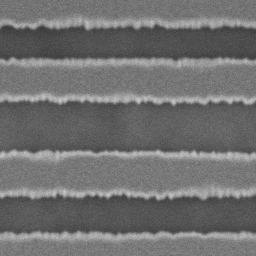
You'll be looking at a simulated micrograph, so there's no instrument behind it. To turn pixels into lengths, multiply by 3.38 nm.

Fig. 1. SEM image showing lines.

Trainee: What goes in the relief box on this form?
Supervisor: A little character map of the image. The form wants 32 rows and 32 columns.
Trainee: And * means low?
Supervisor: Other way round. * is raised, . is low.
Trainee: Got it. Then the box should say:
********************************
********************************
********************************
..*.*......*.........*..*.......
................................
................................
................................
*******.*************..********.
********************************
********************************
********************************
********************************
*****.**************************
................................
................................
................................
................................
................................
................................
********************************
********************************
********************************
********************************
********************************
*..****.***..*..**********.*.*..
................................
................................
................................
................................
********************************
********************************
********************************